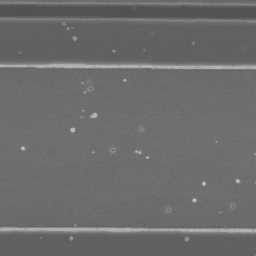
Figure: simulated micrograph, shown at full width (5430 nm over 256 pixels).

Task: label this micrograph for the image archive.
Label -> lines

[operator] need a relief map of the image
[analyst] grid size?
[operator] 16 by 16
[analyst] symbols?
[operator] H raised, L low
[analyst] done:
LLLLLLLLLLLLLLLL
HHHHHHHHHHHHHHHH
HHHHHHHHHHHHHHHH
HHHHHHHHHHHHHHHH
LLLLLLLLLLLLLLLL
LLLLLLLLLLLLLLLL
LLLLLLLLLLLLLLLL
LLLLLLLLLLLLLLLL
LLLLLLLLLLLLLLLL
LLLLLLLLLLLLLLLL
LLLLLLLLLLLLLLLL
LLLLLLLLLLLLLLLL
LLLLLLLLLLLLLLLL
LLLLLLLLLLLLLLLL
HHHHHHHHHHHHHHHH
HHHHHHHHHHHHHHHH